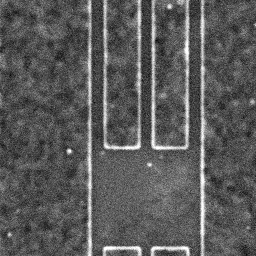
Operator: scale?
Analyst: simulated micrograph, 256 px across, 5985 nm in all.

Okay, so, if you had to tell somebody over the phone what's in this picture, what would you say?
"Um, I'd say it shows wiring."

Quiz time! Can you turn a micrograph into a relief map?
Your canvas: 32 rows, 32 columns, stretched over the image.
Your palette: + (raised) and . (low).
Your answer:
+++++++++++..++++..++++..+++++++
+++++++++++..++++..++++..+++++++
+++++++++++..++++..++++..+++++++
+++++++++++..++++..++++..+++++++
+++++++++++..++++..++++..+++++++
+++++++++++..++++..++++..+++++++
+++++++++++..++++..++++..+++++++
+++++++++++..++++..++++..+++++++
+++++++++++..++++..++++..+++++++
+++++++++++..++++..++++..+++++++
+++++++++++..++++..++++..+++++++
+++++++++++..++++..++++..+++++++
+++++++++++..++++..++++..+++++++
+++++++++++..++++..++++..+++++++
+++++++++++..++++..++++..+++++++
+++++++++++..++++..++++..+++++++
+++++++++++..++++..++++..+++++++
+++++++++++..++++..++++..+++++++
+++++++++++..............+++++++
+++++++++++..............+++++++
+++++++++++..............+++++++
+++++++++++..............+++++++
+++++++++++..............+++++++
+++++++++++..............+++++++
+++++++++++..............+++++++
+++++++++++..............+++++++
+++++++++++..............+++++++
+++++++++++..............+++++++
+++++++++++..............+++++++
+++++++++++..............+++++++
+++++++++++..............+++++++
+++++++++++..+++++.+++++.+++++++